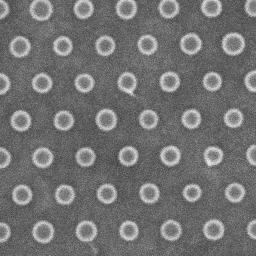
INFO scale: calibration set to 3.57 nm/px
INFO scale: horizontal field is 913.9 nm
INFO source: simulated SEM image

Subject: a regular array of raised bodies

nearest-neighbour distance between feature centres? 151 nanometers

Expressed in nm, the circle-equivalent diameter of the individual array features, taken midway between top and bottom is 64.8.